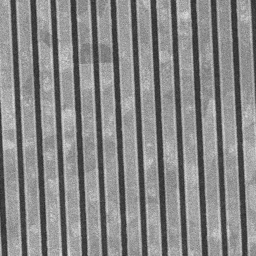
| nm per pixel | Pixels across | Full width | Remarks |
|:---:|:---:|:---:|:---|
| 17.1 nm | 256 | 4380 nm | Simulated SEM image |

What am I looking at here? parallel lines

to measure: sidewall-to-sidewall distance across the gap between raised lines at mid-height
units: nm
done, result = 128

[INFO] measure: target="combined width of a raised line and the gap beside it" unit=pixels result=20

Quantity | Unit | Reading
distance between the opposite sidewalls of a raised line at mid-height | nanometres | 207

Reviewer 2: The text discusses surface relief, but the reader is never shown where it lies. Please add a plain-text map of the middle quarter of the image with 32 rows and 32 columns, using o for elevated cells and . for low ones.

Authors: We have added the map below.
oo..ooo..ooo..ooo..ooo..ooo..ooo
oo..ooo..ooo..ooo..ooo..ooo..ooo
oo..ooo..ooo..ooo..ooo..ooo..ooo
oo..ooo..ooo..ooo..ooo..ooo..ooo
oo..ooo..ooo..ooo..ooo..ooo..ooo
oo..ooo..ooo..ooo..ooo..ooo..ooo
oo..ooo..ooo..ooo..ooo..ooo...oo
oo..ooo...oo..ooo...oo..ooo...oo
oo..ooo..ooo..ooo...oo..ooo...oo
oo..ooo..ooo...oo...oo...ooo.ooo
oo...oo..ooo...oo...oo...ooo.ooo
ooo..oo...ooo..oo...ooo..oo...oo
ooo..oo...ooo..oo...ooo..oo...oo
ooo..oo...ooo..ooo..ooo..ooo..oo
ooo..ooo..ooo..ooo..ooo..ooo..oo
ooo..ooo..ooo..ooo..ooo..ooo..oo
ooo..ooo..ooo..ooo..ooo..ooo..oo
ooo..ooo..ooo..ooo..ooo..ooo..oo
ooo..ooo..ooo..ooo..ooo..ooo..oo
ooo..ooo..ooo..ooo..ooo..ooo..oo
ooo..ooo..ooo..ooo..ooo..ooo..oo
ooo..ooo..ooo..ooo..ooo..ooo..oo
ooo..ooo..ooo..ooo..ooo..ooo..oo
ooo..ooo..ooo..ooo..ooo..ooo..oo
ooo..ooo..ooo..ooo..ooo..ooo..oo
ooo..ooo..ooo..ooo..ooo..ooo..oo
ooo..ooo..ooo..ooo..ooo..ooo..oo
ooo..ooo..ooo..ooo..ooo..ooo..oo
ooo..ooo..ooo..ooo...oo..ooo...o
ooo..ooo..ooo..ooo...oo..ooo...o
.oo..ooo..ooo..oooo..oo..ooo...o
.oo...oo..ooo...ooo..oo...ooo..o